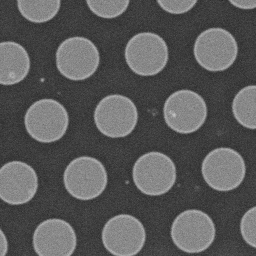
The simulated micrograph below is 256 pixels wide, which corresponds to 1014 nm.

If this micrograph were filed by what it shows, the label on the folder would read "an array of small figures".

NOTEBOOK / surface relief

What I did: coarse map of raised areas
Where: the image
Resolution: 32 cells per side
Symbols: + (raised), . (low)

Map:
..+++++....+++++....++++.....+++
...++++.....+++......++.........
....++..........................
................................
.................+++.....++++...
++......++++....+++++...++++++..
+++....+++++....+++++...++++++..
++++...+++++....+++++....++++...
++++...+++++....++++......++....
+++.....+++.....................
+...............................
......................++......++
.....+.......+++.....++++....+++
....++++....+++++....+++++...+++
...+++++....+++++....+++++...+++
...+++++....+++++....++++.....++
....++++.....+++......++........
.....++.........................
................................
..................+++.....++++..
.++......++++....+++++...++++++.
++++....+++++....+++++...++++++.
+++++...+++++....+++++....++++..
+++++...+++++....++++......++...
++++.....+++....................
................................
.......................++......+
......+.......+++.....++++....++
.....++++....+++++....+++++...++
+...+++++....+++++...++++++...++
+...+++++....+++++....++++.....+
+....++++.....+++......+........